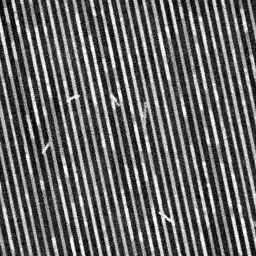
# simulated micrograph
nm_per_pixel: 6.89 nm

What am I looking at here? parallel lines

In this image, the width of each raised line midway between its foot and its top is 19.4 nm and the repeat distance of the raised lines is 58.9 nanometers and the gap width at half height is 39.6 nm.